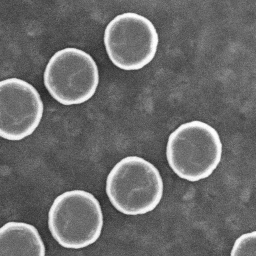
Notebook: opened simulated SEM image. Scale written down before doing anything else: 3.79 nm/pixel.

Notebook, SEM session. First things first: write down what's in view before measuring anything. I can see raised bodies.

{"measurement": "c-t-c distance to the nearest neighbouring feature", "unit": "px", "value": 68.7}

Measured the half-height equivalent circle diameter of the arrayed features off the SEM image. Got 205 nm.